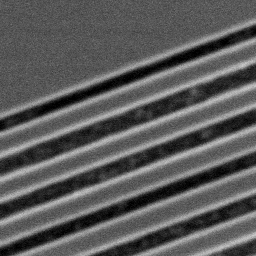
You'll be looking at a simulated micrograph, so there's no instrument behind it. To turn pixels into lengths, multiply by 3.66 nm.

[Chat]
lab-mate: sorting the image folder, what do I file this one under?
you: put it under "parallel lines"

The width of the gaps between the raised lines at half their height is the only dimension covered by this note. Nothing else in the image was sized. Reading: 65.1 nm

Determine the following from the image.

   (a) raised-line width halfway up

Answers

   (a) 81.4 nanometers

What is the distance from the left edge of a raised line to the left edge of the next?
0.15 micrometres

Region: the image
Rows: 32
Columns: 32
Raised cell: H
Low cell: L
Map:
HHHHHHHHHHHHHHHHHHHHHHHHHHHHHHHH
HHHHHHHHHHHHHHHHHHHHHHHHHHHHHHHH
HHHHHHHHHHHHHHHHHHHHHHHHHHHHHHHH
HHHHHHHHHHHHHHHHHHHHHHHHHHHHHHLL
HHHHHHHHHHHHHHHHHHHHHHHHHHHHLLLL
HHHHHHHHHHHHHHHHHHHHHHHHHLLLLLHH
HHHHHHHHHHHHHHHHHHHHHHLLLLLHHHHH
HHHHHHHHHHHHHHHHHHHHLLLLLHHHHHHH
HHHHHHHHHHHHHHHHHLLLLLHHHHHHHHLL
HHHHHHHHHHHHHHLLLLLHHHHHHHHLLLLL
HHHHHHHHHHHLLLLLLHHHHHHHHLLLLLLL
HHHHHHHHHLLLLLHHHHHHHHLLLLLLLHHH
HHHHHHLLLLLHHHHHHHHLLLLLLLHHHHHH
HHHLLLLLHHHHHHHHLLLLLLLLHHHHHHHH
HLLLLLHHHHHHHHLLLLLLLHHHHHHHHLLL
LLLHHHHHHHHLLLLLLLHHHHHHHHLLLLLL
HHHHHHHHLLLLLLLLHHHHHHHLLLLLLLHH
HHHHHHLLLLLLLHHHHHHHHLLLLLLHHHHH
HHHLLLLLLLHHHHHHHHLLLLLLLHHHHHHH
LLLLLLLHHHHHHHHLLLLLLLHHHHHHHHLL
LLLLLHHHHHHHHLLLLLLHHHHHHHHLLLLL
LLHHHHHHHHLLLLLLLHHHHHHHHLLLLLHH
HHHHHHHLLLLLLLHHHHHHHHLLLLLLHHHH
HHHHHLLLLLLHHHHHHHHLLLLLLHHHHHHH
HHLLLLLLLHHHHHHHHLLLLLHHHHHHHHHL
LLLLLLHHHHHHHHLLLLLHHHHHHHHHLLLL
LLLHHHHHHHHLLLLLLHHHHHHHHLLLLLLL
LHHHHHHHHLLLLLHHHHHHHHHLLLLLLHHH
HHHHHHLLLLLHHHHHHHHHLLLLLLHHHHHH
HHHLLLLLLHHHHHHHHLLLLLLLHHHHHHHH
HLLLLLHHHHHHHHHLLLLLLHHHHHHHHLLL
LLLHHHHHHHHHLLLLLLHHHHHHHHHLLLLL